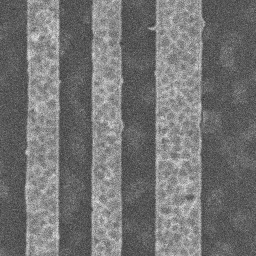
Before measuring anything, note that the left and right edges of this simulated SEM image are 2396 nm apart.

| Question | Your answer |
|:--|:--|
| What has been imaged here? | one or a few lines or trenches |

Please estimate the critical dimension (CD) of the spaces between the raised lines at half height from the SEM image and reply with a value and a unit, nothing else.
0.343 µm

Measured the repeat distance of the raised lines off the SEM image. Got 635 nm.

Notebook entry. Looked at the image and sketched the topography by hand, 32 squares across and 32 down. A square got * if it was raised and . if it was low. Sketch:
....***.....***.....*****.......
....***.....***.....*****.......
....***.....***.....*****.......
....***.....***....******.......
....***.....***.....*****.......
....***.....***.....*****.......
....***.....***.....*****.......
....***.....***.....*****.......
....***.....***.....*****.......
....***.....***.....*****.......
....***.....***.....*****.......
....***.....***.....*****.......
....***.....***.....*****.......
....***.....***.....*****.......
....***.....***.....*****.......
....***.....***.....*****.......
....***.....***.....*****.......
....***.....***.....*****.......
...****.....***.....*****.......
...****.....***.....*****.......
....***.....***.....*****.......
...****.....***.....*****.......
...****.....***.....*****.......
...****.....***.....*****.......
...****.....***.....*****.......
...****.....***.....*****.......
...****.....***.....*****.......
....***.....***.....*****.......
....***.....***.....*****.......
....***.....***.....*****.......
...****.....***.....*****.......
...****.....***.....*****.......